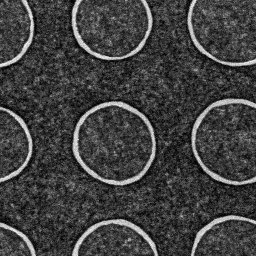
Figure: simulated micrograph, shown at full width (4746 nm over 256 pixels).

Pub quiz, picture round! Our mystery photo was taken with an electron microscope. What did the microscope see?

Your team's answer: raised bodies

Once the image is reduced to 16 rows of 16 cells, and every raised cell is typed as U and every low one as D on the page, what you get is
UUDDDUUUUDDDUUUU
UUDDDUUUUDDDUUUU
UUDDDUUUUDDDUUUU
UDDDDDUUDDDDDUUU
DDDDDDDDDDDDDDDD
DDDDDDDDDDDDDDDD
DDDDDDDDDDDDDDUU
UDDDDUUUUDDDUUUU
UUDDDUUUUUDDUUUU
UUDDDUUUUUDDUUUU
UDDDDUUUUDDDDUUU
DDDDDDDDDDDDDDDD
DDDDDDDDDDDDDDDD
DDDDDDDDDDDDDDDD
UDDDDUUUUDDDDUUU
UUDDDUUUUUDDUUUU